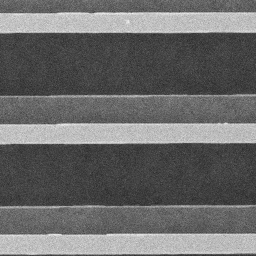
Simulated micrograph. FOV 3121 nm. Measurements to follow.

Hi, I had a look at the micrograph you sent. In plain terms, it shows lines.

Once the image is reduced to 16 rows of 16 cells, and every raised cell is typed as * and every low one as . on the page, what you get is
****************
****************
................
................
................
................
****************
****************
****************
................
................
................
................
****************
****************
****************